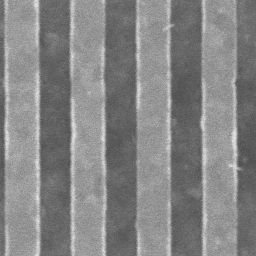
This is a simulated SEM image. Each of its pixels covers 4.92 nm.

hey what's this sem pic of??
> one or a few lines or trenches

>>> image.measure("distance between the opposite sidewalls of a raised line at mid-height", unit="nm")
164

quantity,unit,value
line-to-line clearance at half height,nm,159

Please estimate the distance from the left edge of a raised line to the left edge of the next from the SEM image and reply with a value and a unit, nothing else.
323 nanometres